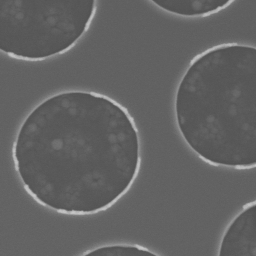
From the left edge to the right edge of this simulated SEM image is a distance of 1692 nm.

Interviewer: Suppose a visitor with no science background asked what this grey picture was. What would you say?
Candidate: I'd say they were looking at holes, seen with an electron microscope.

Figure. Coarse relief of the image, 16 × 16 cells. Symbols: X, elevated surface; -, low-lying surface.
------XXXX----XX
-----XXXXXXXXXXX
-----XXXXXXXXXXX
X--XXXXXXXXXX---
XXXXXXXXXXXX----
XXXXXXXXXXX-----
XXX----XXXX-----
XX------XXX-----
X--------XXX----
X--------XXX----
X-------XXXXXXXX
XX------XXXXXXXX
XXX----XXXXXXXXX
XXXXXXXXXXXXXXX-
XXXXXXXXXXXXXX--
XXXXXX--XXXXXX--